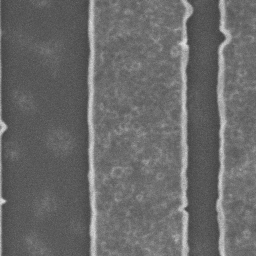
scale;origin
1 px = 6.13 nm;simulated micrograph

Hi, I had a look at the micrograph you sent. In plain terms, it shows one or a few lines or trenches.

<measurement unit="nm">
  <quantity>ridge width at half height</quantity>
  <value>567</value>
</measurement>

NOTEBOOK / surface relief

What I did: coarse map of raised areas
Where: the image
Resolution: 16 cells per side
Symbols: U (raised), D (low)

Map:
DDDDDDUUUUUUDDUU
DDDDDDUUUUUUDDUU
DDDDDDUUUUUUDDUU
DDDDDDUUUUUUDDUU
DDDDDDUUUUUDDDUU
DDDDDDUUUUUDDDUU
DDDDDDUUUUUDDDUU
DDDDDDUUUUUUDDUU
DDDDDDUUUUUDDDUU
DDDDDDUUUUUUDDUU
DDDDDDUUUUUUDDUU
DDDDDDUUUUUDDDUU
DDDDDDUUUUUUDDUU
DDDDDDUUUUUUDDUU
DDDDDDUUUUUUDDUU
DDDDDDUUUUUUDDUU